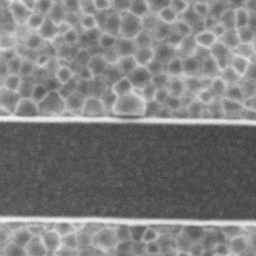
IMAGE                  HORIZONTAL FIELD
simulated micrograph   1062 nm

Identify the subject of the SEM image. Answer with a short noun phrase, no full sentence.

one or a few lines or trenches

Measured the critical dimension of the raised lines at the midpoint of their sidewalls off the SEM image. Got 0.422 µm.